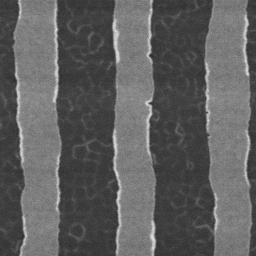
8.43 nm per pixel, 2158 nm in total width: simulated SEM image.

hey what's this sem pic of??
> one or a few lines or trenches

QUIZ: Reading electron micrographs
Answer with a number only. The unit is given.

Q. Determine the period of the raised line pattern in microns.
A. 0.803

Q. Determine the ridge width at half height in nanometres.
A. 316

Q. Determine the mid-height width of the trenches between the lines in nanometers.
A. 488